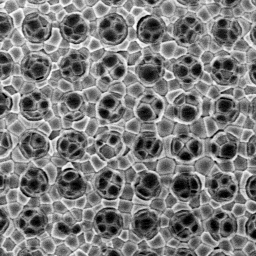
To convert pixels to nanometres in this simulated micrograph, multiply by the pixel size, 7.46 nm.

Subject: a regular array of raised bodies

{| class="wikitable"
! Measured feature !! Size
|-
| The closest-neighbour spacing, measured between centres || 0.233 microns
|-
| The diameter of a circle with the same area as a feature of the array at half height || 0.182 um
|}